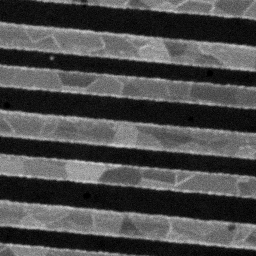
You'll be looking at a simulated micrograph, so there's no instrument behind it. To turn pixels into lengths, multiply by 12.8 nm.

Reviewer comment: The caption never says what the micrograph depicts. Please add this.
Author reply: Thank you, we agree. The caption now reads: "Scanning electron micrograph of lines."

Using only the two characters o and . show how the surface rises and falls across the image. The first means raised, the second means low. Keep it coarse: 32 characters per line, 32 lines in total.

...........ooooooooooooooooooooo
......................oooooooooo
................................
ooooo...........................
oooooooooooooooo................
ooooooooooooooooooooooooo.......
.........ooooooooooooooooooooooo
...................ooooooooooooo
oooo........................oooo
oooooooooooooo..................
ooooooooooooooooooooooooooo.....
.........ooooooooooooooooooooooo
...................ooooooooooooo
...............................o
ooooo...........................
oooooooooooooooo................
oooooooooooooooooooooooooooo....
.........ooooooooooooooooooooooo
..................oooooooooooooo
oo.............................o
ooooooooooooo...................
oooooooooooooooooooooooo........
........oooooooooooooooooooooooo
..................oooooooooooooo
.............................ooo
oo..............................
ooooooooooooo...................
ooooooooooooooooooooooo.........
.....ooooooooooooooooooooooooooo
...............ooooooooooooooooo
o.........................oooooo
ooooooooooo.....................